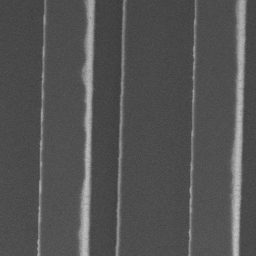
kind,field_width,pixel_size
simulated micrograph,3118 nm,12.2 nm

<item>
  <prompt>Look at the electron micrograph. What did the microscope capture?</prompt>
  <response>lines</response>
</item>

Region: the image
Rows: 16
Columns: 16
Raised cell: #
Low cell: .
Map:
...###......###.
...###......###.
...###......###.
...###......###.
...###......###.
...###......###.
...###......###.
...###......###.
...###......###.
...###......###.
...###......###.
..####......###.
..###.......###.
..###.......###.
..###.......###.
..###.......###.